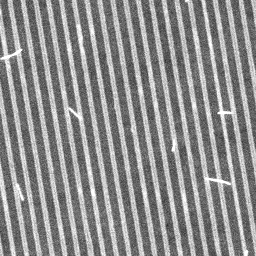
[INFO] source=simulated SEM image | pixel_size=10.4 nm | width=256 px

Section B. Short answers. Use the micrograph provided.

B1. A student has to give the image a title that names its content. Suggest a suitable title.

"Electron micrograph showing parallel lines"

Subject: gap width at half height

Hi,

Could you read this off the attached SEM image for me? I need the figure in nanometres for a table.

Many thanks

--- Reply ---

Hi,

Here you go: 94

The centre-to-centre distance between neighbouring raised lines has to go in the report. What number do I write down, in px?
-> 12.7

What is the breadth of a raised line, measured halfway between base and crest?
39.9 nanometers